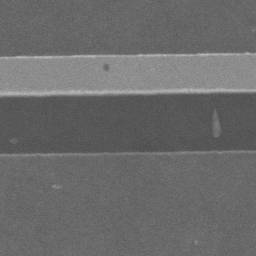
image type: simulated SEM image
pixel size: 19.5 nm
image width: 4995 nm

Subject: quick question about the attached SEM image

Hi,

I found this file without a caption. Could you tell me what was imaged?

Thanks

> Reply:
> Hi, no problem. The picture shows lines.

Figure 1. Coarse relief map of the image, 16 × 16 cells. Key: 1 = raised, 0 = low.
1111111111111111
1111111111111111
1111111111111111
1111111111111111
1111111111111111
1111111111111111
0000000000000000
0000000000000000
0000000000000000
0000000000000000
1111111111111111
1111111111111111
1111111111111111
1111111111111111
1111111111111111
1111111111111111